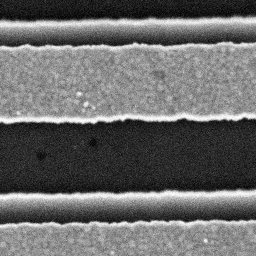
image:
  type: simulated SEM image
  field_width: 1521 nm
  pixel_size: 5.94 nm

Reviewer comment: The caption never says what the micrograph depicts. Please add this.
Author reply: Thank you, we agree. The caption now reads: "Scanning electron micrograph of lines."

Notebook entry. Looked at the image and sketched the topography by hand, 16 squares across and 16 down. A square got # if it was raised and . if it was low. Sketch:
................
..##############
################
################
################
################
################
.....#..........
................
................
................
................
################
################
################
################